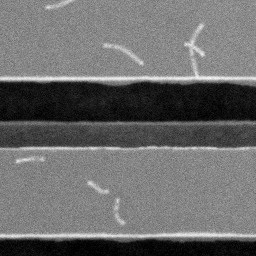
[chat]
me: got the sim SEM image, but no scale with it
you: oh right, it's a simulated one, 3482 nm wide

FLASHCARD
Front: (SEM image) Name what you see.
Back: lines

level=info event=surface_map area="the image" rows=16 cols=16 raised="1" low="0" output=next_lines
1111111111111111
1111111111111111
1111111111111111
1111111111111111
1111111111111111
0000000000000000
0000000000000000
0000000000000000
0000000000000000
1111111111111111
1111111111111111
1111111111111111
1111111111111111
1111111111111111
1111111111111111
0000000000000000